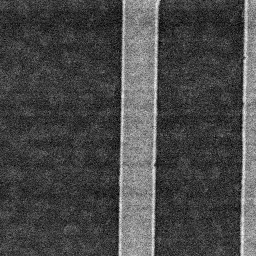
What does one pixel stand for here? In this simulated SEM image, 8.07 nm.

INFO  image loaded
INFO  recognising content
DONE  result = one or a few lines or trenches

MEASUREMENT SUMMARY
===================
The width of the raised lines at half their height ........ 0.267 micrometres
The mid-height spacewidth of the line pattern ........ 720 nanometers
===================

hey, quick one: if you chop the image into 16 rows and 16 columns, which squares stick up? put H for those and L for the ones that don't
LLLLLLLLHHLLLLLH
LLLLLLLLHHLLLLLH
LLLLLLLLHHLLLLLH
LLLLLLLLHHLLLLLH
LLLLLLLLHHLLLLLH
LLLLLLLLHHLLLLLH
LLLLLLLLHHLLLLLH
LLLLLLLLHHLLLLLH
LLLLLLLLHHLLLLLH
LLLLLLLLHHLLLLLH
LLLLLLLLHHLLLLLH
LLLLLLLLHHLLLLLH
LLLLLLLLHHLLLLLH
LLLLLLLLHHLLLLLH
LLLLLLLLHHLLLLLH
LLLLLLLLHHLLLLLH